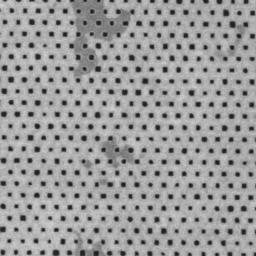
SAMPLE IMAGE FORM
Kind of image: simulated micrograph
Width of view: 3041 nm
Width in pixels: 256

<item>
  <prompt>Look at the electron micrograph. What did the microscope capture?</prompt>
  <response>a regular array of holes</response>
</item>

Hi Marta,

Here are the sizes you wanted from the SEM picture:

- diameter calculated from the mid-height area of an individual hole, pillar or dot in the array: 59.9 nanometres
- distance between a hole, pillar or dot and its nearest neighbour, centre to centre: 153 nanometers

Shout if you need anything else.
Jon